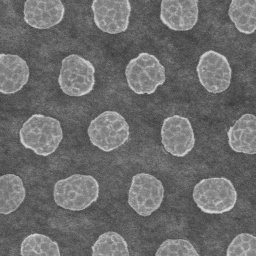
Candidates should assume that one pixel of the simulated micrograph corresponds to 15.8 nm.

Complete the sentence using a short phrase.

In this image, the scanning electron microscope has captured a regular array of raised bodies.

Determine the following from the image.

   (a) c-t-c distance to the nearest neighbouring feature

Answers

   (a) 1060 nanometers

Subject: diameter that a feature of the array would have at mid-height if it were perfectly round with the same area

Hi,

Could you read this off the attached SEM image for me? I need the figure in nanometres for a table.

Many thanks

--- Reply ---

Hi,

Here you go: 601